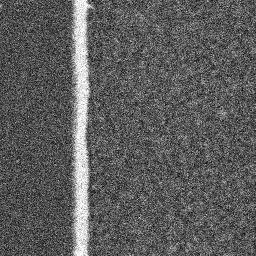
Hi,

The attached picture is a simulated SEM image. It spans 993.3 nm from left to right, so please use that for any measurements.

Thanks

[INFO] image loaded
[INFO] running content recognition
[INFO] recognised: one or a few lines or trenches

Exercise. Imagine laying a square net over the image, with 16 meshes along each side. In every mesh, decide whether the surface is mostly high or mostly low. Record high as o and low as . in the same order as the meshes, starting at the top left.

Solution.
ooooo...........
ooooo...........
ooooo...........
ooooo...........
ooooo...........
ooooo...........
ooooo...........
ooooo...........
ooooo...........
ooooo...........
ooooo...........
ooooo...........
ooooo...........
ooooo...........
ooooo...........
ooooo...........